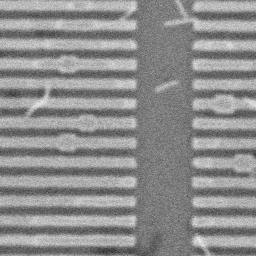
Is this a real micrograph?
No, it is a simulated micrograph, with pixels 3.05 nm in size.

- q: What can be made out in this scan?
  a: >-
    wiring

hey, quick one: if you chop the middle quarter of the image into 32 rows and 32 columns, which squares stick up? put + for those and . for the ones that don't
++++++++++++++++++..............
+++.............................
................................
................................
++++++++++++++++++..............
++++++++++++++++++..............
................................
................................
................................
++++++++++++++++++..............
++++++++++++++++++..............
................................
................................
...+++++........................
++++++++++++++++++..............
++++++++++++++++++..............
................................
................................
+++.............................
++++++++++++++++++..............
++++++++++++++++++..............
................................
................................
+...............................
++++++++++++++++++..............
++++++++++++++++++..............
................................
................................
++++++..++++...+++..............
++++++++++++++++++..............
++++++++++++++++++..............
................................